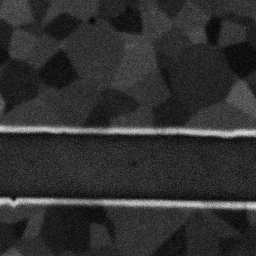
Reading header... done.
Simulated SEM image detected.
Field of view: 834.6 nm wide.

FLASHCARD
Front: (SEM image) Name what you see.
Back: one or a few lines or trenches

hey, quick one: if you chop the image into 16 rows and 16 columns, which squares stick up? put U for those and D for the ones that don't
UUUUUUUUUUUUUUUU
UUUUUUUUUUUUUUUU
UUUUUUUUUUUUUUUU
UUUUUUUUUUUUUUUU
UUUUUUUUUUUUUUUU
UUUUUUUUUUUUUUUU
UUUUUUUUUUUUUUUU
UUUUUUUUUUUUUUUU
DDDDDDDDDDDDDDDD
DDDDDDDDDDDDDDDD
DDDDDDDDDDDDDDDD
DDDDDDDDDDDDDDDD
DDDDDDDDDDDDDDDD
UUUUUUUUUUUUUUUU
UUUUUUUUUUUUUUUU
UUUUUUUUUUUUUUUU